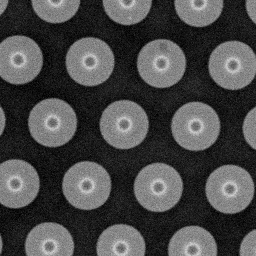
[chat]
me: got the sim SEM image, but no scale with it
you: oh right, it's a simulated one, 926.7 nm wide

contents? an array of small figures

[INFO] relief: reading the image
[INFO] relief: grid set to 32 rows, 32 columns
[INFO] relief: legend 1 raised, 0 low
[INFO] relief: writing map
10001111110001111110001111110001
00001111110001111110001111110001
00000011000000111100000111100000
00000000000000000000000000000000
00000000000000000000000000000000
11111000011110000011110000001110
11111000111111000011111000011111
11111000111111000111111000111111
11111000111111000111111000111111
11111000011111000011111000111111
00100000001100000001110000011110
00000000000000000000000000000000
00000011000000000000000000000000
00001111100001111100000111000000
10001111100001111100001111100001
10001111110001111110011111100011
00001111100001111100001111100011
00001111100001111100001111100001
00000000000000010000000111000000
00000000000000000000000000000000
11110000011100000001100000000000
11111000111110000111110000011110
11111000111111000111111000111111
11111000111111000111111000111111
11111000111111000111111000111111
11110000011110000011110000111110
00000000000000000000000000001100
00000000000000000000000000000000
00001111000000111000000110000000
00011111100001111100001111000001
00011111100011111100011111100011
00011111100011111100011111100011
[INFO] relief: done